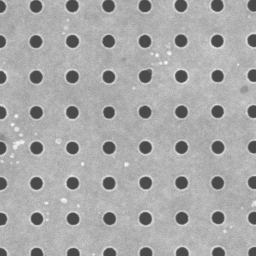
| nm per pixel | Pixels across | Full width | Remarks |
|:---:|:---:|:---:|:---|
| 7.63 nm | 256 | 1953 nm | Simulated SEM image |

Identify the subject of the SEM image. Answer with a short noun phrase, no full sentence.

a regular array of holes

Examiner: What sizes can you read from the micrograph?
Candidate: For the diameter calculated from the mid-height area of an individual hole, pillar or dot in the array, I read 100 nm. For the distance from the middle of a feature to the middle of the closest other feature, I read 270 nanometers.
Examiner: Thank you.